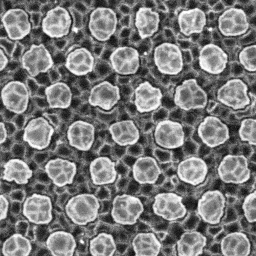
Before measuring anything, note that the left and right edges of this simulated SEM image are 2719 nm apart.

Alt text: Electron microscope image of a regular array of raised bodies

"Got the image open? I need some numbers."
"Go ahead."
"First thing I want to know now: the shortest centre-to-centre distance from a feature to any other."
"42 pixels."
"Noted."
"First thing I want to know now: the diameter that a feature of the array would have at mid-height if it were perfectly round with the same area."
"298 nm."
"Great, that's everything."